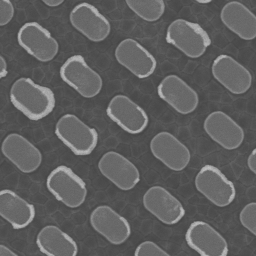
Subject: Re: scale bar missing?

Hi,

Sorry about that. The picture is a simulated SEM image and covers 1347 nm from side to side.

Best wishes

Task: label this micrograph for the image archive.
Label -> a regular array of raised bodies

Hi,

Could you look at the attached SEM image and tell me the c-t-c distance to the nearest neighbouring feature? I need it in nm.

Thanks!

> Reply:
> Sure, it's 288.